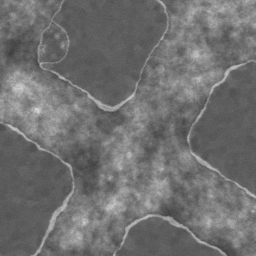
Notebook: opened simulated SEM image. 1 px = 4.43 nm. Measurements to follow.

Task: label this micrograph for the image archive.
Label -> raised bodies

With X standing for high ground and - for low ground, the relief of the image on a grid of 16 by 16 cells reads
----XXXXXX------
---XXXXXXX------
---XXXXXXX------
--XXXXXXX-------
---XXXXXX-----XX
-----XXXX----XXX
------XX-----XXX
------------XXXX
XX----------XXXX
XXX---------XXXX
XXXX---------XXX
XXXXX----------X
XXXX------------
XXXX------------
XXX-----XXXX----
XXX----XXXXXX---